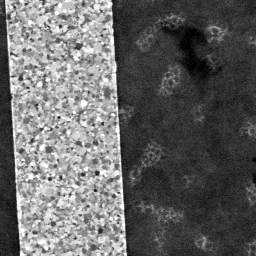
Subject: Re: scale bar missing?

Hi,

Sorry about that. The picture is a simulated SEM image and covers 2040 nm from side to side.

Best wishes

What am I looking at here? one or a few lines or trenches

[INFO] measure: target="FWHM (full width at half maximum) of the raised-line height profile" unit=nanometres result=835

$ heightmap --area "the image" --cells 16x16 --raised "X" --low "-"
XXXXXXX---------
XXXXXXX---------
-XXXXXX---------
-XXXXXX---------
-XXXXXX---------
-XXXXXX---------
-XXXXXX---------
-XXXXXX---------
-XXXXXX---------
-XXXXXX---------
-XXXXXXX--------
-XXXXXXX--------
-XXXXXXX--------
-XXXXXXX--------
-XXXXXXX--------
-XXXXXXX--------